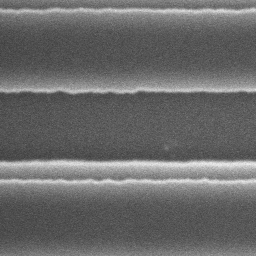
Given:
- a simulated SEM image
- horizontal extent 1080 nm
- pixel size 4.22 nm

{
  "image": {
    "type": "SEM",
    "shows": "lines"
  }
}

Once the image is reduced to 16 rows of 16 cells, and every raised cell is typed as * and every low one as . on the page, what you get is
................
****************
****************
****************
****************
****************
................
................
................
................
................
****************
****************
****************
****************
****************